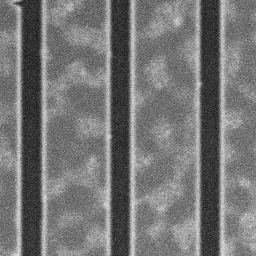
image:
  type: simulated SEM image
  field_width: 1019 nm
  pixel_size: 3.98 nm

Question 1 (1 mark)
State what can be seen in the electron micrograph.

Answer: one or a few lines or trenches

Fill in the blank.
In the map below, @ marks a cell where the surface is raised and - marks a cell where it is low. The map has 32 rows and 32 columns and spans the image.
@@---@@@@@@@@@---@@@@@@@@---@@@@
@@@--@@@@@@@@@---@@@@@@@@---@@@@
@@@--@@@@@@@@@---@@@@@@@@---@@@@
@@@--@@@@@@@@@---@@@@@@@@---@@@@
@@@--@@@@@@@@@---@@@@@@@@---@@@@
@@@--@@@@@@@@@---@@@@@@@@---@@@@
@@@--@@@@@@@@@---@@@@@@@@---@@@@
@@@--@@@@@@@@@---@@@@@@@@---@@@@
@@@--@@@@@@@@@---@@@@@@@@---@@@@
@@@--@@@@@@@@@---@@@@@@@@---@@@@
@@@--@@@@@@@@@---@@@@@@@@---@@@@
@@@--@@@@@@@@@---@@@@@@@@---@@@@
@@@--@@@@@@@@@---@@@@@@@@---@@@@
@@@--@@@@@@@@@---@@@@@@@@---@@@@
@@@--@@@@@@@@@---@@@@@@@@---@@@@
@@@--@@@@@@@@@---@@@@@@@@---@@@@
@@@--@@@@@@@@@--@@@@@@@@@---@@@@
@@@--@@@@@@@@@--@@@@@@@@@---@@@@
@@@--@@@@@@@@@--@@@@@@@@@---@@@@
@@@--@@@@@@@@@--@@@@@@@@@---@@@@
@@@--@@@@@@@@@--@@@@@@@@@---@@@@
@@@--@@@@@@@@@--@@@@@@@@@---@@@@
@@@--@@@@@@@@@--@@@@@@@@@---@@@@
@@@--@@@@@@@@@--@@@@@@@@@---@@@@
@@@--@@@@@@@@@--@@@@@@@@@---@@@@
@@@--@@@@@@@@@--@@@@@@@@@---@@@@
@@@--@@@@@@@@@--@@@@@@@@@---@@@@
@@@--@@@@@@@@@--@@@@@@@@@---@@@@
@@@--@@@@@@@@@--@@@@@@@@@---@@@@
@@@--@@@@@@@@@--@@@@@@@@@---@@@@
@@@--@@@@@@@@@--@@@@@@@@@---@@@@
@@@--@@@@@@@@@--@@@@@@@@@---@@@@